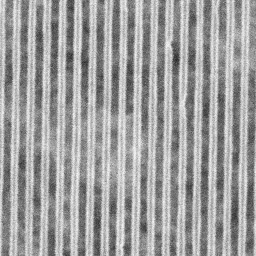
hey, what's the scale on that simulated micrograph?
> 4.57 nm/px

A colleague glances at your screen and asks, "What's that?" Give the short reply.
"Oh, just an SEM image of parallel lines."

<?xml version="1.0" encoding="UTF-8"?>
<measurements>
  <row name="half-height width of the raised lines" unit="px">5.89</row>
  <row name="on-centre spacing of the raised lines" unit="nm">69.7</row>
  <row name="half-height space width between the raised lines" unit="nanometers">41.2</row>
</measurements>